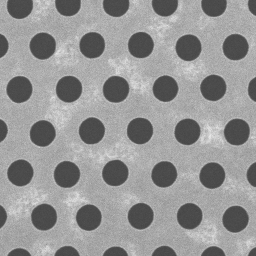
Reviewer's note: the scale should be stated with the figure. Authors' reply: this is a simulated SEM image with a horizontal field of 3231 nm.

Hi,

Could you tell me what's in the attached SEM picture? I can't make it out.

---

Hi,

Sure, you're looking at a regular array of holes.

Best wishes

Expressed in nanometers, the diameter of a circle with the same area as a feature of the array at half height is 329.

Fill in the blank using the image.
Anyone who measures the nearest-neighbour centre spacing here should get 597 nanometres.